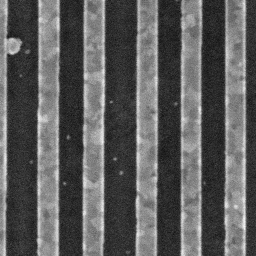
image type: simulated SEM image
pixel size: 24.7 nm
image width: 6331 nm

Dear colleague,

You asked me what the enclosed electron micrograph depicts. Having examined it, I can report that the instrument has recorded lines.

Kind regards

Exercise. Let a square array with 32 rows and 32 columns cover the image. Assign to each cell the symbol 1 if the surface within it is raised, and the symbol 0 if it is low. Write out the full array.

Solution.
10000110000110000111000110001110
10000110000110000111000110001110
10000110000110000111000110001110
10000110000110000111000110001110
10000110000110000111000110001110
11000110000110000111000110001110
10000110000110000111000110001110
10000110000110000111000110001110
10000110000110000111000110001110
10000110000110000111000110001110
10000110000110000111000110001110
10000110000110000111000110001110
10000110000110000111000110001110
10000110000110000111000110001110
10000110000110000111000110001110
10000110000110000111000110001110
10000110000110000111000110001110
10000110000110000111000110001110
10000110000110000111000110001110
10000110000110000111000110001110
10000110001110000111000110001110
10000110001110000111000110001110
10000110001110000111000110001110
10000110001110000111000110001110
10000110001110000111000110001110
10000110001110000111000110001110
10000110001110000111000110001110
10000110001110000111000110001110
10000110001110000111000110001110
10000110001110000111000110001110
10000110001110000111000110001110
10000110001110000111000110001110